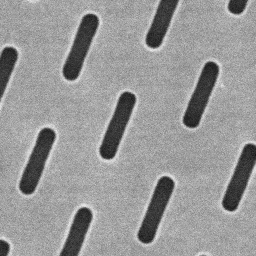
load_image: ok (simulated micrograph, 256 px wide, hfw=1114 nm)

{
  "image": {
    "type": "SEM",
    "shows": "holes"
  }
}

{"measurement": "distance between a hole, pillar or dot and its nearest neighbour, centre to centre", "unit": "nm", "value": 382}